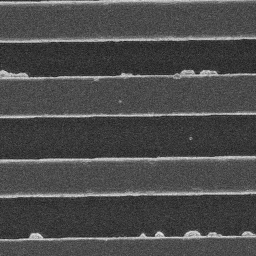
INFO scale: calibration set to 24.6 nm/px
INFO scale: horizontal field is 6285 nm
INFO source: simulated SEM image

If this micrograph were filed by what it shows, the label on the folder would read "lines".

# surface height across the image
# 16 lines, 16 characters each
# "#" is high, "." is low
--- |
################
################
############....
................
................
################
################
................
................
................
################
################
................
................
................
################